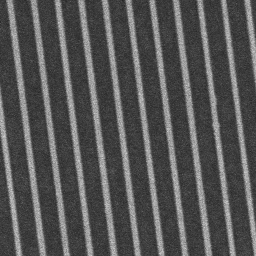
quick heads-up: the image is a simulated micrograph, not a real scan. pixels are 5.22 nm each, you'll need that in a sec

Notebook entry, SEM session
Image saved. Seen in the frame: parallel lines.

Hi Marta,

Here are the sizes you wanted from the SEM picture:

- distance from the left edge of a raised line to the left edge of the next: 123 nm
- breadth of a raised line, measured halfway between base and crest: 0.0226 um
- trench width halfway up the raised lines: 0.0991 µm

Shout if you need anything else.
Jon